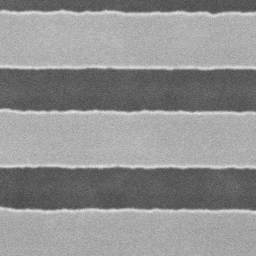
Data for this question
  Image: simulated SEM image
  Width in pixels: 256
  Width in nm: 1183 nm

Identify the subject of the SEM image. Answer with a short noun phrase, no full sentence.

lines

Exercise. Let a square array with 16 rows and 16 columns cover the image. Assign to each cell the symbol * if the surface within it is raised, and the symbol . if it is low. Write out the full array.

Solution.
................
****************
****************
****************
................
................
................
****************
****************
****************
................
................
................
****************
****************
****************